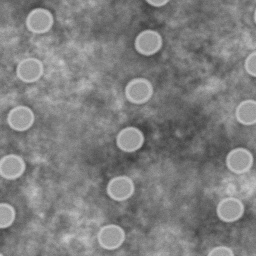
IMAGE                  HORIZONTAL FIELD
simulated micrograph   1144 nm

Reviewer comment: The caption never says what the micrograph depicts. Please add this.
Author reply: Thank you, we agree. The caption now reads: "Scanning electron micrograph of a regular array of raised bodies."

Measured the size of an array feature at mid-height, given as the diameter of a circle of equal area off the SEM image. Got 0.11 microns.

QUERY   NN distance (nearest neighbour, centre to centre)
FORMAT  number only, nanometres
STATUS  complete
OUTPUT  221